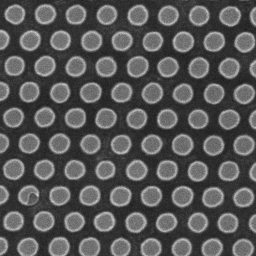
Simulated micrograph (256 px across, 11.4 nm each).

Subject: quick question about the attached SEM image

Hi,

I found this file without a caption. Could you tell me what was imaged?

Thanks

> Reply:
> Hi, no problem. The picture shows a regular array of raised bodies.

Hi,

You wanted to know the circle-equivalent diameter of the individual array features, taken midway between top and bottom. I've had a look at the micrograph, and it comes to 0.231 um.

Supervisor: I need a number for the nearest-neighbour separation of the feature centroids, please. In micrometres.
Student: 0.342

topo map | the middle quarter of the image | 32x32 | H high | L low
LHHHHLLLHHHHHLLLHHHHHLLHHHHHHLLH
LHHHHLLLHHHHHLLLHHHHHLLLHHHHHLLH
LHHHHLLLLHHHLLLLHHHHLLLLHHHHLLLL
LLLLLLLLLLLLLLLLLLLLLLLLLLLLLLLL
LLLLLLLLLLLLLLLLLLLLLLLLLLLLLLLL
HLLLLHHHHLLLLHHHLLLLHHHHLLLLLHHL
HLLLHHHHHLLLHHHHHLLLHHHHHLLLHHHH
HLLLHHHHHLLLHHHHHLLHHHHHHLLHHHHH
HLLLHHHHHLLLHHHHLLLLHHHHLLLLHHHH
LLLLLLLLLLLLLLLLLLLLLHHLLLLLLHHL
LLLLLLLLLLLLLLLLLLLLLLLLLLLLLLLL
LLHHHLLLLHHHLLLLLHHHLLLLLLLLLLLL
LHHHHLLLHHHHHLLLHHHHHLLLHHHHLLLH
HHHHHLLLHHHHHLLLHHHHHLLLHHHHLLLH
LHHHHLLLHHHHHLLLHHHHHLLLHHHHLLLH
LLHHHLLLLHHHLLLLHHHHLLLLHHHLLLLL
LLLLLLLLLLLLLLLLLLLLLLLLLLLLLLLL
LLLLLLLLLLLLLLLLLLLLLLLLLLLLLLLL
HLLLLHHHLLLLLHHHLLLLHHHHLLLLHHHL
HLLLHHHHHLLLHHHHHLLLHHHHLLLHHHHH
HLLLHHHHHLLLHHHHHLLLHHHHLLLHHHHH
HLLLLHHHLLLLHHHHLLLLHHHHLLLHHHHH
LLLLLLLLLLLLLHLLLLLLLLLLLLLLLHHL
LLLLLLLLLLLLLLLLLLLLLLLLLLLLLLLL
LHHHLLLLLHHHLLLLLHHHLLLLHHHLLLLL
LHHHHLLLHHHHHLLLHHHHLLLLHHHHLLLH
HHHHHLLLHHHHHLLLHHHHHLLHHHHHLLLH
HHHHHLLLHHHHLLLLHHHHLLLHHHHHLLLH
LHHHLLLLLHHLLLLLHHHHLLLLHHHLLLLL
LLLLLLLLLLLLLLLLLLLLLLLLLLLLLLLL
LLLLLLLLLLLLLLLLLLLLLLLLLLLLLLLL
HLLLLHHHHLLLHHHHLLLLHHHHLLLLHHHH